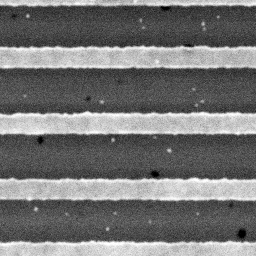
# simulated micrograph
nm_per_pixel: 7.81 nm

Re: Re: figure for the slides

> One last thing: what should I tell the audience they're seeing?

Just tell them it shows lines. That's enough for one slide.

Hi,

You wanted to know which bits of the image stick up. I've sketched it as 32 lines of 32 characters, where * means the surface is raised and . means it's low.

********************************
................................
................................
................................
................................
................................
********************************
********************************
.........................*......
................................
................................
................................
................................
................................
********************************
********************************
********************************
................................
................................
................................
................................
................................
**.***.*********.*********.***..
********************************
********************************
................................
................................
................................
................................
................................
********************************
********************************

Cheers